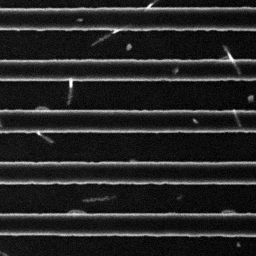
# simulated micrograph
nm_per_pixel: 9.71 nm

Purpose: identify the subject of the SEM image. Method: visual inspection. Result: lines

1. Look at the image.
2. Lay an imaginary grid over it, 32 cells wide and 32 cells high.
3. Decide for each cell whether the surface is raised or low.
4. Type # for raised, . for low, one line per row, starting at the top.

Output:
................................
################################
################################
################################
................................
................................
................................
...........#.............##.##..
################################
################################
................................
................................
................................
................................
################################
################################
#########...#####.##########..#.
................................
................................
................................
################################
################################
################################
................................
................................
................................
................................
################################
################################
............................####
................................
................................